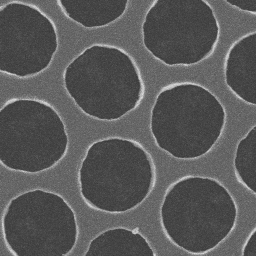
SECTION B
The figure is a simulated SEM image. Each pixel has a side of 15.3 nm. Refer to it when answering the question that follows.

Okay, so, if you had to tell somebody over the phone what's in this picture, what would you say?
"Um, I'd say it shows holes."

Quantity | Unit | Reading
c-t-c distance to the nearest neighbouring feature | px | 89.8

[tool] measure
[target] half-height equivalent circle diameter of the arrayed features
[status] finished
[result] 73.6 pixels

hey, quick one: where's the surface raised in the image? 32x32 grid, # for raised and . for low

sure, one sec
#..#####........###.......###...
.....###.......####........#####
......###.....####.........#####
.......###########.........#####
.......###########.........####.
.......###########.........###..
.......###.....####.......###...
......###.......####.....###....
......##.........###########....
##..####.........###########....
########..........##########....
#########.........##......###...
#########........###.......####.
......####.......##.........####
.......#####...####.........####
........###########.........####
........###########.........###.
........#####..#####.......###..
........###.......##......####..
........###........###...####...
#......###.........##########...
##########.........###########..
##########.........####....###..
##########.........##.......###.
##.....###........###........###
#.......###......###.........###
#........###########..........##
#........###########.........###
#.........###########........###
#........###......###.......###.
#........##.......####.....####.
##.......##........#####.#####..